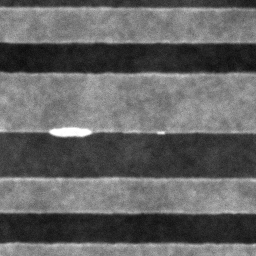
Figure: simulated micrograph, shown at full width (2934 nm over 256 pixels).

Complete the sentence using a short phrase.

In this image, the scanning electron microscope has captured lines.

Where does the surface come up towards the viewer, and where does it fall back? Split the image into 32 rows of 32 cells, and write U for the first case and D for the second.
DDDDDDDDDDDDDDDDDDDDDDDDDDDDDDDD
UUUUUUUUUUUUUUUUUUUUUUUUUUUUUUUU
UUUUUUUUUUUUUUUUUUUUUUUUUUUUUUUU
UUUUUUUUUUUUUUUUUUUUUUUUUUUUUUUU
UUUUUUUUUUUUUUUUUUUUUUUUUUUUUUUU
DDDDDDDDDDDDDDDDDDDDDDDDDDDDDDDD
DDDDDDDDDDDDDDDDDDDDDDDDDDDDDDDD
DDDDDDDDDDDDDDDDDDDDDDDDDDDDDDDD
DDDDDDDDDDDDDDDDDDDDDDDDDDDDDDDD
UUUUUUUUUUUUUUUUUUUUUUUUUUUUUUUU
UUUUUUUUUUUUUUUUUUUUUUUUUUUUUUUU
UUUUUUUUUUUUUUUUUUUUUUUUUUUUUUUU
UUUUUUUUUUUUUUUUUUUUUUUUUUUUUUUU
UUUUUUUUUUUUUUUUUUUUUUUUUUUUUUUU
UUUUUUUUUUUUUUUUUUUUUUUUUUUUUUUU
UUUUUUUUUUUUUUUUUUUUUUUUUUUUUUUU
DDDDDDUUUUUUDDDUUUUUUUUUDUUUUUUU
DDDDDDDDDDDDDDDDDDDDDDDDDDDDDDDD
DDDDDDDDDDDDDDDDDDDDDDDDDDDDDDDD
DDDDDDDDDDDDDDDDDDDDDDDDDDDDDDDD
DDDDDDDDDDDDDDDDDDDDDDDDDDDDDDDD
DDDDDDDDDDDDDDDDDDDDDDDDDDDDDDDD
UUUUUUUUUUUUUUUUUUUUUUUUUUUUUUUU
UUUUUUUUUUUUUUUUUUUUUUUUUUUUUUUU
UUUUUUUUUUUUUUUUUUUUUUUUUUUUUUUU
UUUUUUUUUUUUUUUUUUUUUUUUUUUUUUUU
DDDDUUDDDDDDUUDUUUDDDDUUUUUUUUUU
DDDDDDDDDDDDDDDDDDDDDDDDDDDDDDDD
DDDDDDDDDDDDDDDDDDDDDDDDDDDDDDDD
DDDDDDDDDDDDDDDDDDDDDDDDDDDDDDDD
UUUUDUDUUUUUDDUUDUUUUUUDDDDDDUDD
UUUUUUUUUUUUUUUUUUUUUUUUUUUUUUUU